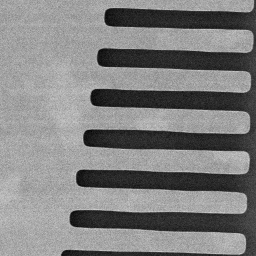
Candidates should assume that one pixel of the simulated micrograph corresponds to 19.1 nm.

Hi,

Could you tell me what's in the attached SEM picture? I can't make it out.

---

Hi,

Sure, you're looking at groups of lines, slits or small figures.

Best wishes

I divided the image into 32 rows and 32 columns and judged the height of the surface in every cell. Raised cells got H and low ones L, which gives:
HHHHHHHHHHHHHHHHHHHHHHHHHHHHHHHH
HHHHHHHHHHHHHLLLLLLLLLLLLLLLLLLL
HHHHHHHHHHHHHLLLLLLLLLLLLLLLLLLL
HHHHHHHHHHHHHHHHHLLLLLLLLLLLLLLL
HHHHHHHHHHHHHHHHHHHHHHHHHHHHHHHH
HHHHHHHHHHHHHHHHHHHHHHHHHHHHHHHH
HHHHHHHHHHHHLLLLLLLLLLLLLLLLLLHL
HHHHHHHHHHHHLLLLLLLLLLLLLLLLLLLL
HHHHHHHHHHHHHHLLLLLLLLLLLLLLLLLL
HHHHHHHHHHHHHHHHHHHHHHHHHHHHHHHL
HHHHHHHHHHHHHHHHHHHHHHHHHHHHHHHL
HHHHHHHHHHHLLLLLLLLLLLLLLLLLLHHL
HHHHHHHHHHHLLLLLLLLLLLLLLLLLLLLL
HHHHHHHHHHHHHHLLLLLLLLLLLLLLLLLL
HHHHHHHHHHHHHHHHHHHHHHHHHHHHHHHL
HHHHHHHHHHHHHHHHHHHHHHHHHHHHHHHL
HHHHHHHHHHHLLLLLLLLLLLLHHHHHHHHL
HHHHHHHHHHLLLLLLLLLLLLLLLLLLLLLL
HHHHHHHHHHHHHHLLLLLLLLLLLLLLLLLL
HHHHHHHHHHHHHHHHHHHHHHHHHHHHHHHL
HHHHHHHHHHHHHHHHHHHHHHHHHHHHHHHL
HHHHHHHHHHLLLLLLLLLLLLLHHHHHHHHL
HHHHHHHHHHLLLLLLLLLLLLLLLLLLLLLL
HHHHHHHHHHHHHLLLLLLLLLLLLLLLLLLL
HHHHHHHHHHHHHHHHHHHHHHHHHHHHHHHL
HHHHHHHHHHHHHHHHHHHHHHHHHHHHHHHL
HHHHHHHHHLLLLLLLHHHHLLLHHHHHHHLL
HHHHHHHHHLLLLLLLLLLLLLLLLLLLLLLL
HHHHHHHHHHHLLLLLLLLLLLLLLLLLLLLL
HHHHHHHHHHHHHHHHHHHHHHHHHHHHHHLL
HHHHHHHHHHHHHHHHHHHHHHHHHHHHHHHL
HHHHHHHHLLLLLLLLLLLLHHHHHHHHHHLL